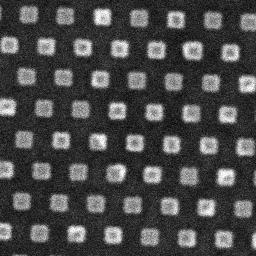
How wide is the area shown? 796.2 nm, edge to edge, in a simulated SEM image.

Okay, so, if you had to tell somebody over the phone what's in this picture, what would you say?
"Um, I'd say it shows a regular array of raised bodies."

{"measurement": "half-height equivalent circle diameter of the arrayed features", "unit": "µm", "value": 0.0538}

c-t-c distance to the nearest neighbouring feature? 112 nanometres